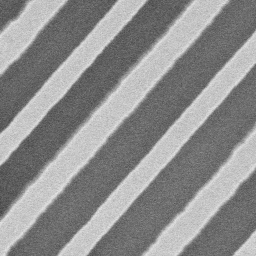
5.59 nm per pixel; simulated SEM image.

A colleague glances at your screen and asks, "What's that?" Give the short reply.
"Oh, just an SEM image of lines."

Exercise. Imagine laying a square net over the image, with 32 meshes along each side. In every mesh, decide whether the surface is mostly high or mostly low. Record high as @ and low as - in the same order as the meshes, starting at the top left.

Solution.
----@@@@------@@@@------@@@@----
---@@@@-------@@@------@@@@-----
--@@@@-------@@@------@@@@------
-@@@@-------@@@------@@@@-------
@@@@-------@@@-------@@@@-------
@@@@------@@@-------@@@@-------@
@@@------@@@@------@@@@-------@@
@@------@@@@------@@@@-------@@@
@------@@@@------@@@@-------@@@-
------@@@@------@@@@-------@@@--
------@@@------@@@@-------@@@@--
-----@@@------@@@@-------@@@@---
----@@@------@@@@@------@@@@----
---@@@------@@@@@-------@@@-----
--@@@@------@@@@-------@@@------
-@@@@------@@@@-------@@@-------
@@@@------@@@@-------@@@--------
@@@------@@@@-------@@@--------@
@@------@@@@-------@@@--------@@
@------@@@@-------@@@@-------@@@
------@@@@@------@@@@-------@@@@
-----@@@@-------@@@@-------@@@@-
-----@@@@-------@@@--------@@@--
----@@@@-------@@@--------@@@@--
---@@@@-------@@@-------@@@@@---
--@@@@-------@@@--------@@@@----
-@@@@-------@@@--------@@@@-----
@@@@-------@@@@-------@@@@------
@@@@------@@@@-------@@@@-------
@@@------@@@@-------@@@@-------@
@-------@@@@-------@@@@-------@@
@-------@@@-------@@@@--------@@